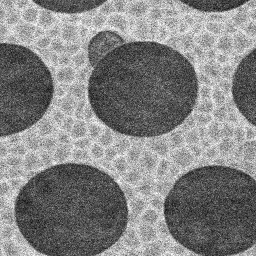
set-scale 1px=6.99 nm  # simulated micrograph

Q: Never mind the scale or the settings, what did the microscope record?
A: holes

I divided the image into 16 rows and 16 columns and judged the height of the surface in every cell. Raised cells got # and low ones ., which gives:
###...######...#
################
######..########
..####.....####.
...###......###.
...###......###.
...###......###.
..####......###.
########..######
################
###...######...#
##.....####.....
#.......##......
#.......##......
#.......###.....
##.....#####....